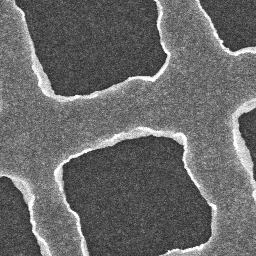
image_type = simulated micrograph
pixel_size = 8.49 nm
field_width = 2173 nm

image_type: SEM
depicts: holes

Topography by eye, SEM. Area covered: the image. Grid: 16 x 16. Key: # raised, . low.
#.........###...
##........###...
##........####..
##........######
###.......######
###....#########
################
###############.
#########.#####.
#####......####.
####........####
.###........####
..##.........###
..###........###
..###........###
...##.......####